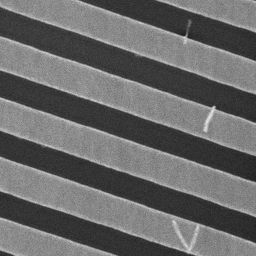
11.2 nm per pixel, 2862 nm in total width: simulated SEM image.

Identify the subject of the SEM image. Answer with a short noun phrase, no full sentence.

lines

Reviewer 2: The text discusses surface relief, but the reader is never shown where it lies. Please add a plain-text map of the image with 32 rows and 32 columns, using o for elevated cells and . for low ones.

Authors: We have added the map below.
ooooooooooo..........ooooooooooo
..oooooooooooo..........oooooooo
.....oooooooooooo..........ooooo
........oooooooooooo..........oo
...........oooooooooooo.........
ooo...........ooooooooooo.......
oooooo...........oooooooooooo...
ooooooooo...........ooooooooooo.
oooooooooooo..........oooooooooo
..oooooooooooo...........ooooooo
.....ooooooooooooo..........oooo
........ooooooooooooo..........o
o..........oooooooooooo.........
oooo..........ooooooooooooo.....
ooooooo..........oooooooooooo...
oooooooooo..........oooooooooooo
.oooooooooooo..........ooooooooo
....oooooooooooo..........oooooo
.......oooooooooooo..........ooo
.........ooooooooooooo..........
ooo..........oooooooooooo.......
oooooo..........oooooooooooo....
ooooooooo.........ooooooooooooo.
ooooooooooo..........ooooooooooo
..oooooooooooo...........ooooooo
.....ooooooooooooo.........ooooo
........oooooooooooo..........oo
o..........oooooooooooo.........
oooo..........oooooooooooo......
ooooooo..........oooooooooooo...
oooooooooo..........oooooooooooo
.oooooooooooo..........ooooooooo